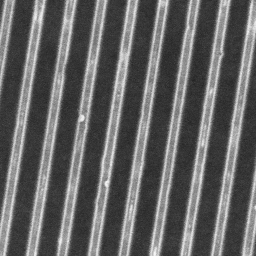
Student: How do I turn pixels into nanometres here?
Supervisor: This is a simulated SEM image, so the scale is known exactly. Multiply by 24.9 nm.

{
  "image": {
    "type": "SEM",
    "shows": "parallel lines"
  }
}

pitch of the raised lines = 758 nm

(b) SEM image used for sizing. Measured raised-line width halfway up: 600 nm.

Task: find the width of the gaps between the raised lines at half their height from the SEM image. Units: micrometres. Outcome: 0.166